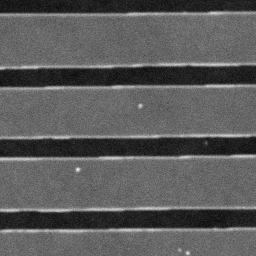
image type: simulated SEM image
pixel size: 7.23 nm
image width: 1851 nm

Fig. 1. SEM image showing lines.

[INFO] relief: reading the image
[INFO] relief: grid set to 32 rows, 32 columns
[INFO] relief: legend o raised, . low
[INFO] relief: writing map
................................
................................
oooooooooooooooooooooooooooooooo
oooooooooooooooooooooooooooooooo
oooooooooooooooooooooooooooooooo
oooooooooooooooooooooooooooooooo
oooooooooooooooooooooooooooooooo
oooooooooooooooooooooooooooooooo
ooooo...........................
................................
................................
oooooooooooooooooooooooooooooooo
oooooooooooooooooooooooooooooooo
oooooooooooooooooooooooooooooooo
oooooooooooooooooooooooooooooooo
oooooooooooooooooooooooooooooooo
oooooooooooooooooooooooooooooooo
................................
................................
.............................ooo
oooooooooooooooooooooooooooooooo
oooooooooooooooooooooooooooooooo
oooooooooooooooooooooooooooooooo
oooooooooooooooooooooooooooooooo
oooooooooooooooooooooooooooooooo
oooooooooooooooooooooooooooooooo
................................
................................
................................
oooooooooooooooooooooooooooooooo
oooooooooooooooooooooooooooooooo
oooooooooooooooooooooooooooooooo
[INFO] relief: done